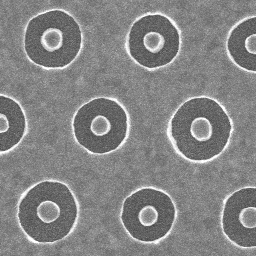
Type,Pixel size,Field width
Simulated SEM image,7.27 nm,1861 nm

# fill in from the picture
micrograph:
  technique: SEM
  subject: ring-shaped grooves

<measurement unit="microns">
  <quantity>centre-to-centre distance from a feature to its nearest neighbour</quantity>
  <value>0.723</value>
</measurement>